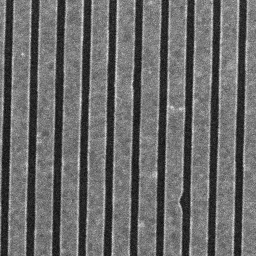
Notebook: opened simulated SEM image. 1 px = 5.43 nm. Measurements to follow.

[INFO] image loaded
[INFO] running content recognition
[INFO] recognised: parallel lines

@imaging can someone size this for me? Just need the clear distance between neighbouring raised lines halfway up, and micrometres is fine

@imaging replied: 0.0469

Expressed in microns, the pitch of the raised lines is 0.141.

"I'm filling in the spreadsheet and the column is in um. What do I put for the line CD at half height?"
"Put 0.093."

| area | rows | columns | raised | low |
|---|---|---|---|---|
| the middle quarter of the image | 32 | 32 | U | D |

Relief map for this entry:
UUUUDDDUUUUDDUUUUDDDUUUUDDUUUUDD
UUUUDDDUUUUDDUUUUDDDUUUUDDUUUUDD
UUUUDDDUUUUDDUUUUDDDUUUUDDUUUUDD
UUUUDDDUUUUDDUUUUDDDUUUUDDUUUUDD
UUUUDDDUUUUDDUUUUDDUUUUUDDUUUUDD
UUUUDDDUUUUDDUUUUDDUUUUUDDUUUUDD
UUUUDDDUUUUDDUUUUDDUUUUUDDUUUUDD
UUUUDDDUUUUDDUUUUDDUUUUUDDUUUUDD
UUUUDDDUUUUDDUUUUDDUUUUUDDUUUUDD
UUUUDDUUUUUDDUUUUDDUUUUUDDUUUUDD
UUUUDDUUUUUDDUUUUDDUUUUUDDUUUUDD
UUUUDDUUUUUDDUUUUDDUUUUUDDUUUUDD
UUUUDDUUUUDDDUUUUDDUUUUUDDUUUUDD
UUUUDDUUUUDDDUUUUDDUUUUUDDUUUUDD
UUUUDDUUUUDDDUUUUDDUUUUDDDUUUUDD
UUUUDDUUUUDDDUUUUDDUUUUDDDUUUUDD
UUUUDDUUUUDDDUUUUDDUUUUDDDUUUUDD
UUUUDDUUUUDDDUUUUDDUUUUDDDUUUUDD
UUUUDDUUUUDDDUUUUDDUUUUDDDUUUUDD
UUUUDDUUUUDDDUUUUDDUUUUDDDUUUUDD
UUUUDDUUUUDDDUUUUDDUUUUDDDUUUUDD
UUUUDDUUUUDDDUUUUDDUUUUDDDUUUUDD
UUUUDDUUUUDDDUUUUDDUUUUDDDUUUUDD
UUUUDDUUUUDDDUUUUDDUUUUDDDUUUUDD
UUUUDDUUUUDDDUUUUDDUUUUDDUUUUUDD
UUUUDDUUUUDDDUUUUDDUUUUDDUUUUUDD
UUUUDDUUUUDDDUUUUDDUUUUDDUUUUUDD
UUUUDDUUUUDDDUUUUDDUUUUDDUUUUDDD
UUUUDDUUUUDDDUUUUDDUUUUDDUUUUDDD
UUUUDDUUUUDDUUUUUDDUUUUDDUUUUDDD
UUUUDDUUUUDDUUUUUDDUUUUDDUUUUDDD
UUUUDDUUUUDDUUUUUDDUUUUDDUUUUDDD